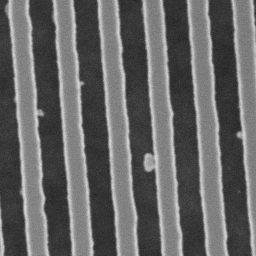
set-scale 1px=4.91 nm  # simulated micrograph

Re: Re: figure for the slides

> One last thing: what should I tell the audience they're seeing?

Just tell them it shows lines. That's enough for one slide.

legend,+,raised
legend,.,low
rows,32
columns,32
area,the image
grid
.+++...++...+++...++...+++...+++
.+++...++...+++...+++..+++...+++
.+++...++...+++...+++...++...+++
.+++...++...+++...+++...++...+++
.+++...++....++...+++...++...+++
.+++...++....++...+++...++...+++
..++...+++...++...+++...++....++
..++...+++...++...+++...++....++
..++...+++...++....++...+++...++
..++...+++...+++...++...+++...++
..++...+++...+++...++...+++...++
..+++..+++...+++...++...+++...++
..+++..+++...+++...++...+++...++
..+++...++...+++...++...+++...++
..+++...++...+++...+++...++...++
..+++...++...+++...+++...++...++
..+++...++....++...+++...++...++
..+++...++....++...+++...++...++
...++...+++...++...+++...++....+
...++...+++...++...+++...+++...+
...++...+++...++...+++...+++...+
...++...+++...++...+++...+++...+
...++...+++...++....++...+++...+
...++...+++...+++...++...+++...+
...+++..+++...+++...++...+++...+
...+++...++...+++...++...+++...+
...+++...++...+++...++...+++...+
...+++...++...+++...++...+++...+
...+++...++....++...+++...++...+
...+++...+++...++...+++...++...+
...+++...+++...++...+++...++...+
....++...+++...++...+++...++...+